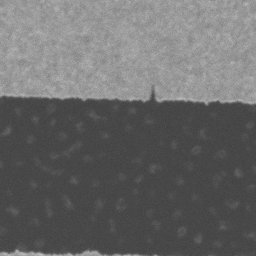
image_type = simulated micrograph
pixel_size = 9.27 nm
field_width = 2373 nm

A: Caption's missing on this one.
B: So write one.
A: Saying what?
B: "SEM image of one or a few lines or trenches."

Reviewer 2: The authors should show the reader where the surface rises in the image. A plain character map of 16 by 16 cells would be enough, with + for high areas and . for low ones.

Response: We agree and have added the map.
++++++++++++++++
++++++++++++++++
++++++++++++++++
++++++++++++++++
++++++++++++++++
++++++++++++++++
................
................
................
................
................
................
................
................
................
................